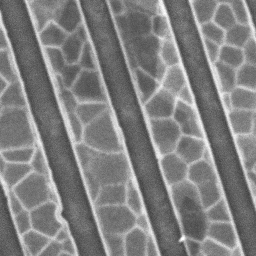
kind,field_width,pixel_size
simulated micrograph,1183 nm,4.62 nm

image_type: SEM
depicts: one or a few lines or trenches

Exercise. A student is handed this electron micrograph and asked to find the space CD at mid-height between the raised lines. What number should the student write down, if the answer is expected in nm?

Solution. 132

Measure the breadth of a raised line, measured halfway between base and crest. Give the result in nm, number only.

227